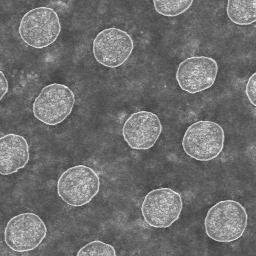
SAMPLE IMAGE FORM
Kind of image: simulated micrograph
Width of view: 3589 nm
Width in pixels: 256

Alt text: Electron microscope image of a regular array of raised bodies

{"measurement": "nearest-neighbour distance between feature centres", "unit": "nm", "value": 966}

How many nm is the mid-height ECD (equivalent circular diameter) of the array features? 552